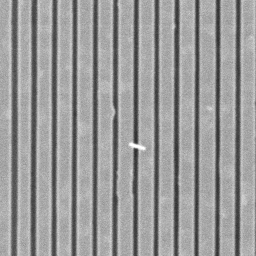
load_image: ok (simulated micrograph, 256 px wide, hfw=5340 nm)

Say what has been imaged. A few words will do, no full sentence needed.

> parallel lines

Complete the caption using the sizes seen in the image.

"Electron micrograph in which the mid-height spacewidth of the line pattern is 122 nanometres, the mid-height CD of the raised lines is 0.305 micrometres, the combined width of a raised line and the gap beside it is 424 nanometers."